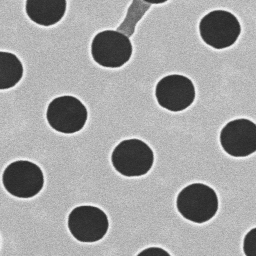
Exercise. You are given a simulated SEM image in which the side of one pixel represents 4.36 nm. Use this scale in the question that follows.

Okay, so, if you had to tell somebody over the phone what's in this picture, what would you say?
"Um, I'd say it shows a regular array of holes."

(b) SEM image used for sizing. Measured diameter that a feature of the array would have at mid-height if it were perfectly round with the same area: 173 nm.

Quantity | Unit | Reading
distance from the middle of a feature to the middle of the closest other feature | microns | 0.339